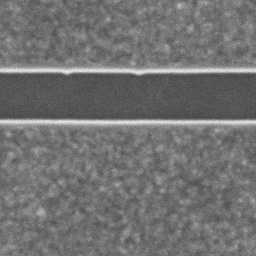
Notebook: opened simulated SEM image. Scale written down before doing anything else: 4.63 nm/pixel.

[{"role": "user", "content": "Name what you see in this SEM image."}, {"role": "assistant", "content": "one or a few lines or trenches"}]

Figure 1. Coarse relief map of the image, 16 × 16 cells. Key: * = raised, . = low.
****************
****************
****************
****************
................
................
................
................
****************
****************
****************
****************
****************
****************
****************
****************